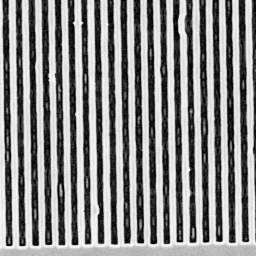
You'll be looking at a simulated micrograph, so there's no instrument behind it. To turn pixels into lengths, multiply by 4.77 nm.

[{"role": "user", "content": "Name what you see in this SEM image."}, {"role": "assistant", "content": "parallel lines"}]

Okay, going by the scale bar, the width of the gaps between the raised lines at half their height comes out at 37.6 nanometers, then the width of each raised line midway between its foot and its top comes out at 25.7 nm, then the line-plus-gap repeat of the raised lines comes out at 62.7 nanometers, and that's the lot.